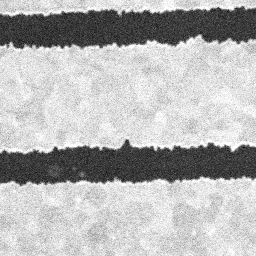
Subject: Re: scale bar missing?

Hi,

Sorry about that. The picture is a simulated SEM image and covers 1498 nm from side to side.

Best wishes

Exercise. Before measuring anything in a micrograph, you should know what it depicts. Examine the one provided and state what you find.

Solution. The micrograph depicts one or a few lines or trenches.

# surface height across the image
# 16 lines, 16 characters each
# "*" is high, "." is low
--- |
*************...
................
............*...
****************
****************
****************
****************
****************
****************
................
................
...*************
****************
****************
****************
****************